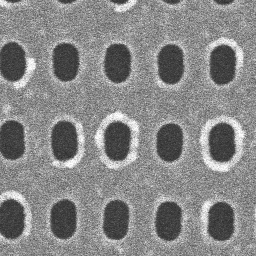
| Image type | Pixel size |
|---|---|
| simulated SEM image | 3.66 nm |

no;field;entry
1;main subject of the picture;a regular array of holes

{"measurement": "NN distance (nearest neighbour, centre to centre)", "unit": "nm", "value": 191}